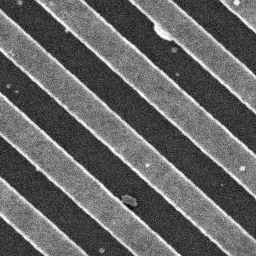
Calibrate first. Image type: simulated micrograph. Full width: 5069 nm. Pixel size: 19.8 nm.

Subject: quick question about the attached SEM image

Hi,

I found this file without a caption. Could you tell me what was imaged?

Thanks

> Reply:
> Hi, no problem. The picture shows lines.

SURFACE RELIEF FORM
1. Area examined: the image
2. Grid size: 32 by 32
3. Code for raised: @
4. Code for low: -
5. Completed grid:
-----@@@@@@------@@@@@------@@@@
------@@@@@@------@@@@@------@@@
@------@@@@@@------@@@@@------@@
@@@-----@@@@@@-----@@@@@@------@
@@@@------@@@@@-----@@@@@@------
@@@@@------@@@@@------@@@@@-----
@@@@@@------@@@@@------@@@@@@---
-@@@@@@------@@@@@@------@@@@@--
---@@@@@------@@@@@@------@@@@@-
----@@@@@------@@@@@@------@@@@@
-----@@@@@------@@@@@@------@@@@
------@@@@@------@@@@@@------@@@
@------@@@@@------@@@@@@------@@
@@------@@@@@@------@@@@@------@
@@@------@@@@@@------@@@@@------
@@@@------@@@@@@------@@@@@@----
@@@@@------@@@@@@------@@@@@@---
-@@@@@-------@@@@@------@@@@@@--
--@@@@@@------@@@@@------@@@@@@-
---@@@@@@------@@@@@------@@@@@@
----@@@@@@------@@@@@------@@@@@
-----@@@@@@------@@@@@------@@@@
------@@@@@@------@@@@@@------@@
@@------@@@@@------@@@@@@------@
@@@------@@@@@------@@@@@@------
@@@@------@@@@@@@----@@@@@@-----
@@@@@------@@@@@-------@@@@@----
-@@@@@------@@@@@@------@@@@@---
--@@@@@------@@@@@@------@@@@@--
---@@@@@------@@@@@@------@@@@@-
----@@@@@------@@@@@@------@@@@@
-----@@@@@@------@@@@@------@@@@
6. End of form